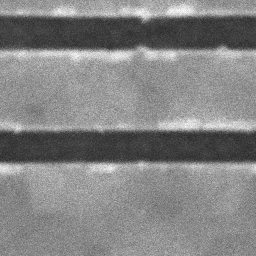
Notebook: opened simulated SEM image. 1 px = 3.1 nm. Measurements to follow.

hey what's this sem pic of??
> one or a few lines or trenches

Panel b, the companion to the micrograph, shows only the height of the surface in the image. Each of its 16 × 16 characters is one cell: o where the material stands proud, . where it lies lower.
oooooooooooooooo
................
................
ooo.oooooooooooo
oooooooooooooooo
oooooooooooooooo
oooooooooooooooo
oooooooooooooooo
................
................
oooooooooooooooo
oooooooooooooooo
oooooooooooooooo
oooooooooooooooo
oooooooooooooooo
oooooooooooooooo